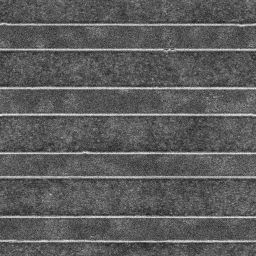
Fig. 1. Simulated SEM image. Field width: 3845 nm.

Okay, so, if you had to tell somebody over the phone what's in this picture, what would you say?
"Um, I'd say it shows one or a few lines or trenches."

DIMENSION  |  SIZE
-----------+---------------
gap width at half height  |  38.9 pixels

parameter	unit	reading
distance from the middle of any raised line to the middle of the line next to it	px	63.9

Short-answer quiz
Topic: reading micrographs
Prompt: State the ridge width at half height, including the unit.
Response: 374 nanometers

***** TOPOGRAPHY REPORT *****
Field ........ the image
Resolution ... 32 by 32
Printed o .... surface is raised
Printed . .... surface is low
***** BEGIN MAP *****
................................
................................
................................
oooooooooooooooooooooooooooooooo
oooooooooooooooooooooooooooooooo
oooooooooooooooooooooooooooooooo
................................
................................
................................
................................
................................
oooooooooooooooooooooooooooooooo
oooooooooooooooooooooooooooooooo
oooooooooooooooooooooooooooooooo
................................
................................
................................
................................
................................
oooooooooooooooooooooooooooooooo
oooooooooooooooooooooooooooooooo
oooooooooooooooooooooooooooooooo
................................
................................
................................
................................
................................
oooooooooooooooooooooooooooooooo
oooooooooooooooooooooooooooooooo
oooooooooooooooooooooooooooooooo
................................
................................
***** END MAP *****